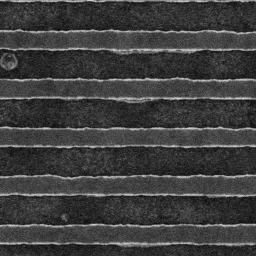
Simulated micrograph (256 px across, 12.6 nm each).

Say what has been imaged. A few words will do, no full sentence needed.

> lines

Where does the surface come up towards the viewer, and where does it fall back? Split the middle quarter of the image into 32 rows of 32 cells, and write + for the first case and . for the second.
................................
................................
................................
............................+...
++++++++++++++++++++++++++++++++
++++++++++++++++++++++++++++++++
++++++++++++++++++++++++++++++++
++++++++++++++++++++++++++++++++
.........+++++++++++.+..++++++++
................................
................................
................................
................................
................................
................................
................................
++++++++++++++++++++++++++++++++
++++++++++++++++++++++++++++++++
++++++++++++++++++++++++++++++++
++++++++++++++++++++++++++++++++
++++++++++++++++......+.++++++++
................................
................................
................................
................................
................................
................................
................................
++++++++++++++++++++++++++++++++
++++++++++++++++++++++++++++++++
++++++++++++++++++++++++++++++++
++++++++++++++++++++++++++++++++